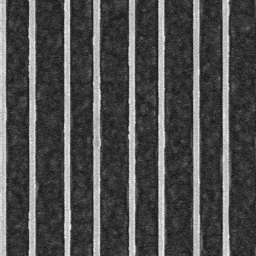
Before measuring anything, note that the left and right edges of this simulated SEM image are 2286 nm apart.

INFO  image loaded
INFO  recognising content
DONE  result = parallel lines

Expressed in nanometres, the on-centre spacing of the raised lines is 288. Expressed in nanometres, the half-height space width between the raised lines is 218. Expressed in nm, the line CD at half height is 46.9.